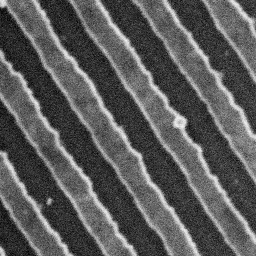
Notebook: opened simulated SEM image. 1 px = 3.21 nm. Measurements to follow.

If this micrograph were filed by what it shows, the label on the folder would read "lines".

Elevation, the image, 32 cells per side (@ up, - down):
@@@@@----@@@@----@@@@-----@@@@--
-@@@@-----@@@-----@@@@----@@@@--
--@@@@----@@@@-----@@@-----@@@@-
---@@@-----@@@@----@@@@----@@@@@
---@@@@----@@@@-----@@@@----@@@@
----@@@-----@@@@-----@@@@----@@@
-----@@@-----@@@@----@@@@-----@@
@----@@@@-----@@@-----@@@@----@@
@@----@@@@----@@@@----@@@@-----@
@@@----@@@@----@@@@----@@@@----@
@@@----@@@@@---@@@@-----@@@@----
@@@@----@@@@----@@@@-----@@@@---
@@@@-----@@@@----@@@@----@@@@---
-@@@@----@@@@-----@@@-----@@@@--
--@@@-----@@@@----@@@@@----@@@@-
--@@@@-----@@@-----@@@@----@@@@-
---@@@@----@@@@----@@@@-----@@@-
----@@@-----@@@@----@@@@-----@@@
----@@@@----@@@@@----@@@@----@@@
@----@@@@----@@@@@----@@@-----@@
@-----@@@-----@@@@----@@@@-----@
@@-----@@@-----@@@-----@@@-----@
@@-----@@@@----@@@@----@@@@-----
@@@-----@@@-----@@@@----@@@@----
@@@@----@@@@-----@@@-----@@@----
-@@@-----@@@@----@@@@----@@@@---
-@@@@-----@@@-----@@@@----@@@@--
--@@@@----@@@@----@@@@-----@@@@-
--@@@@-----@@@@----@@@@----@@@@-
---@@@@-----@@@-----@@@@----@@@@
----@@@@----@@@@-----@@@-----@@@
-----@@@-----@@@@----@@@@----@@@